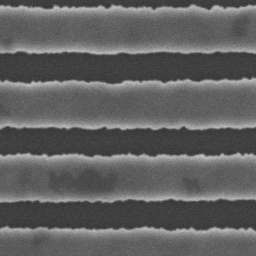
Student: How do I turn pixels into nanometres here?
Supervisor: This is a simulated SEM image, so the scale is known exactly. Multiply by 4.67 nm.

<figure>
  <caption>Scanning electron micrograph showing lines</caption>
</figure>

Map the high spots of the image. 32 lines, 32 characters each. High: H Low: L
LLLLLLLLLLLLLLLLLLLLLLLLLLLLLLLL
HHHHHHHHHHHHHHHHHHHHHHHHHHHHHHHH
HHHHHHHHHHHHHHHHHHHHHHHHHHHHHHHH
HHHHHHHHHHHHHHHHHHHHHHHHHHHHHHHH
HHHHHHHHHHHHHHHHHHHHHHHHHHHHHHHH
HHHHHHHHHHHHHHHHHHHHHHHHHHHHHHHH
HHLHHHHHLLHHHHHHHHHHLHHHHHHLHLHH
LLLLLLLLLLLLLLLLLLLLLLLLLLLLLLLL
LLLLLLLLLLLLLLLLLLLLLLLLLLLLLLLL
LLLLLLLLLLLLLLLLLLLLLLLLLLLLLLLL
HHHHHHHHHHHHHHLHHHHHHHHHHHHHHHHH
HHHHHHHHHHHHHHHHHHHHHHHHHHHHHHHH
HHHHHHHHHHHHHHHHHHHHHHHHHHHHHHHH
HHHHHHHHHHHHHHHHHHHHHHHHHHHHHHHH
HHHHHHHHHHHHHHHHHHHHHHHHHHHHHHHH
HHHHHHHHHHHHHHHHHHHHHHHHHHHHHHHH
LLLLLLLLLLLLLLLLLLLLLLLLLLLLLLLL
LLLLLLLLLLLLLLLLLLLLLLLLLLLLLLLL
LLLLLLLLLLLLLLLLLLLLLLLLLLLLLLLL
HHHHHHLHHHHLLLHHHHHLHHHHHHLHHHHH
HHHHHHHHHHHHHHHHHHHHHHHHHHHHHHHH
HHHHHHHHHHHHHHHHHHHHHHHHHHHHHHHH
HHHHHHHHHHHHHHHHHHHHHHHHHHHHHHHH
HHHHHHHHHHHHHHHHHHHHHHHHHHHHHHHH
HHHHHHHHHHHHHHHHHHHHHHHHHHHHHHHH
LLLLLLLLLLLLLLLLLLLLLLLLLLLLLLLL
LLLLLLLLLLLLLLLLLLLLLLLLLLLLLLLL
LLLLLLLLLLLLLLLLLLLLLLLLLLLLLLLL
HLLLLHLLLLLLLLLLLLHLLLLLLLLLLLLL
HHHHHHHHHHHHHHHHHHHHHHHHHHHHHHHH
HHHHHHHHHHHHHHHHHHHHHHHHHHHHHHHH
HHHHHHHHHHHHHHHHHHHHHHHHHHHHHHHH